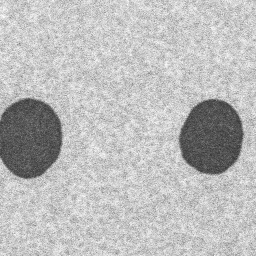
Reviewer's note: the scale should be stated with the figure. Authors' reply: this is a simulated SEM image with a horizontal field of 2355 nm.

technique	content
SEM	holes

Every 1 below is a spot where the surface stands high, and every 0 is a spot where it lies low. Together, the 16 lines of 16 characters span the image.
1111111111111111
1111111111111111
1111111111111111
1111111111111111
1111111111111111
1111111111111111
1001111111110011
0000111111110001
0000111111100001
0000111111100001
0001111111110011
1111111111111111
1111111111111111
1111111111111111
1111111111111111
1111111111111111